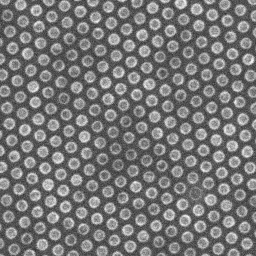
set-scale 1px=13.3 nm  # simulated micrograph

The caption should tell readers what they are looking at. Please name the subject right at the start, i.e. a regular array of raised bodies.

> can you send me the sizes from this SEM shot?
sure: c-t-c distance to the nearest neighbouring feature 216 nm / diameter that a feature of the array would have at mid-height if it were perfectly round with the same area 132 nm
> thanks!